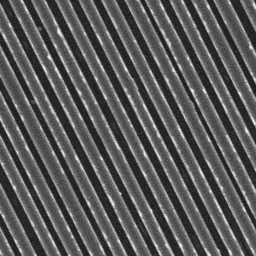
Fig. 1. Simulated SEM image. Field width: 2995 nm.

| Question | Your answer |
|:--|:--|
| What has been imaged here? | parallel lines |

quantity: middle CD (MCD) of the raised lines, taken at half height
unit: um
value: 0.144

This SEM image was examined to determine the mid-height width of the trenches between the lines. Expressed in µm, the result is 0.098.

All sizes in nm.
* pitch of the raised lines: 240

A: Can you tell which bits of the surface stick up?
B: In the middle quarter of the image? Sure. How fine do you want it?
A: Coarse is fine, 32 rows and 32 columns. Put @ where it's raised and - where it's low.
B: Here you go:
@@@---@@@@--@@@---@@@---@@@--@@@
-@@@---@@@---@@@--@@@@--@@@@-@@@
-@@@---@@@@--@@@---@@@---@@@--@@
--@@@---@@@---@@@--@@@@--@@@@-@@
--@@@---@@@@--@@@@--@@@---@@@--@
---@@@---@@@---@@@--@@@@--@@@@-@
@--@@@---@@@@--@@@---@@@---@@@--
@---@@@---@@@---@@@--@@@@--@@@@-
@@--@@@---@@@@--@@@---@@@---@@@-
@@---@@@---@@@---@@@--@@@@--@@@@
@@@--@@@@--@@@@--@@@---@@@---@@@
@@@---@@@---@@@---@@@--@@@@--@@@
-@@@--@@@---@@@@--@@@---@@@---@@
-@@@---@@@---@@@---@@@--@@@@--@@
--@@@--@@@@--@@@@--@@@---@@@---@
--@@@---@@@---@@@---@@@--@@@@--@
---@@@--@@@@--@@@@--@@@---@@@---
---@@@---@@@---@@@---@@@--@@@@--
@---@@@--@@@@--@@@@--@@@---@@@--
@---@@@---@@@---@@@---@@@--@@@@-
@@---@@@--@@@@--@@@@--@@@---@@@-
@@---@@@@--@@@---@@@---@@@--@@@@
@@@---@@@--@@@@--@@@@--@@@---@@@
@@@---@@@@--@@@---@@@---@@@--@@@
-@@@---@@@--@@@@--@@@@--@@@---@@
-@@@---@@@@--@@@---@@@---@@@--@@
--@@@---@@@--@@@@--@@@@--@@@---@
--@@@---@@@@--@@@---@@@---@@@--@
@--@@@---@@@--@@@@--@@@@--@@@---
@--@@@---@@@@--@@@---@@@---@@@--
@@--@@@---@@@--@@@@--@@@@--@@@--
@@--@@@---@@@@--@@@---@@@---@@@-